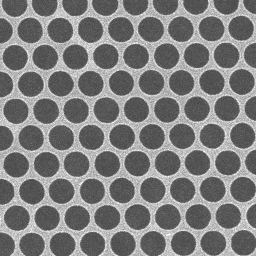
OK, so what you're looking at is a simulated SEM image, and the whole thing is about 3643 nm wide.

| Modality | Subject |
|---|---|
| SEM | a regular array of holes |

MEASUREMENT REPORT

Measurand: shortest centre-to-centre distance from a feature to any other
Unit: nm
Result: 427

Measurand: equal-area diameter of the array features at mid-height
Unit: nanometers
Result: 367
